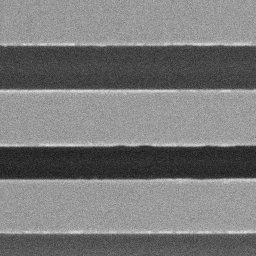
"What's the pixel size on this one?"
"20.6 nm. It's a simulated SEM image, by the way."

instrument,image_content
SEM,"lines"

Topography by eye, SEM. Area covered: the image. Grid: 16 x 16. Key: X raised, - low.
XXXXXXXXXXXXXXXX
XXXXXXXXXXXXXXXX
XXXXXXXXXXXXXXXX
----------------
----------------
----------------
XXXXXXXXXXXXXXXX
XXXXXXXXXXXXXXXX
XXXXXXXXXXXXXXXX
----------------
----------------
XXXXXXXXXXXXXXXX
XXXXXXXXXXXXXXXX
XXXXXXXXXXXXXXXX
XXXXXXXXXXXXXXXX
----------------